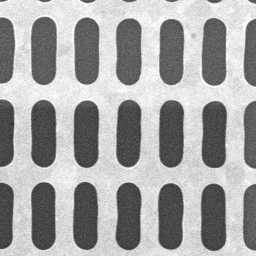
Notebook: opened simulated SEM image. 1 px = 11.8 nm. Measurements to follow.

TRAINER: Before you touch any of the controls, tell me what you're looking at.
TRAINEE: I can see groups of lines, slits or small figures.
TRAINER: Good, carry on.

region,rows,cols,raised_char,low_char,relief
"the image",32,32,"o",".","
oooooooooooooooooooooooooooooooo
oooooooooooooooooooooooooooooooo
.ooo...ooo..ooo..oooo.oooo..ooo.
..oo...oo...ooo...oo...oo...ooo.
..oo...oo....o....oo...oo...ooo.
..oo...oo...oo....oo...oo...ooo.
..oo...oo...oo....oo...oo...oo..
..oo...oo...oo....oo...oo...oo..
..oo...oo...oo....oo...oo...oo..
..oo...oo...ooo...oo...oo...oo..
ooooo.oooo.oooo..oooo.oooo..ooo.
oooooooooooooooooooooooooooooooo
.oooo.ooooooooooooooo.oooooooooo
..oo...oo...ooo...oo...oo...ooo.
..oo...oo...ooo...oo...oo...oo..
..oo...oo...ooo...oo...oo...oo..
..oo...oo...oo....oo...oo...oo..
..oo...oo...oo....oo...oo...oo..
..oo...oo...oo....oo...oo...oo..
..oo...oo...oo....oo...oo...oo..
.ooo...ooo..ooo..ooo..oooo..ooo.
oooooooooooooooooooooooooooooooo
oooooooooooooooooooooooooooooooo
.ooo...oo...ooo..ooo...ooo..ooo.
..oo...oo...oo....oo...oo...oo..
..oo...oo...ooo...oo...oo...oo..
..oo...oo...ooo...oo...oo...oo..
..oo...oo...ooo...oo...oo...oo..
..oo...oo...ooo...oo...oo...oo..
..oo...oo...oo....oo...oo...oo..
.ooo...oo...ooo..ooo...oo...ooo.
oooooooooooooooooooooooooooooooo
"